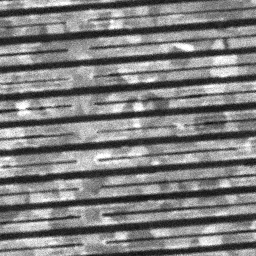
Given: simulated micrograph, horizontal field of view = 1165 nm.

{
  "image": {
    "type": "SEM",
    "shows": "parallel lines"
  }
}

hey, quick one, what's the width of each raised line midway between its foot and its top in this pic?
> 35.7 nm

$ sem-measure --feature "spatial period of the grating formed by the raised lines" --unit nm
63